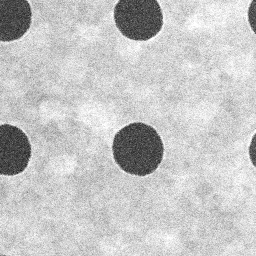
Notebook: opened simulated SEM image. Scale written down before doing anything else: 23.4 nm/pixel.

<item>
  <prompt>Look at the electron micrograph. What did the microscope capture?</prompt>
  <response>holes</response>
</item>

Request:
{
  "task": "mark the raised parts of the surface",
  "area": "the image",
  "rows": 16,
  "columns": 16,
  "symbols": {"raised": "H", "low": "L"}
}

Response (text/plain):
LLHHHHHLLLHHHHHH
LLHHHHHLLLHHHHHH
LHHHHHHHLHHHHHHH
HHHHHHHHHHHHHHHH
HHHHHHHHHHHHHHHH
HHHHHHHHHHHHHHHH
HHHHHHHHHHHHHHHH
HHHHHHHHHHHHHHHH
LLHHHHHLLLHHHHHH
LLHHHHHLLLHHHHHH
LLHHHHHHLLHHHHHH
HHHHHHHHHHHHHHHH
HHHHHHHHHHHHHHHH
HHHHHHHHHHHHHHHH
HHHHHHHHHHHHHHHH
HHHHHHHHHHHHHHHH